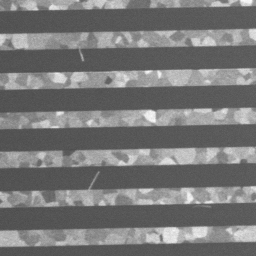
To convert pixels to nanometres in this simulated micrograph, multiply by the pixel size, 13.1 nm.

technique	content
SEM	parallel lines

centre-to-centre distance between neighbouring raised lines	513	nm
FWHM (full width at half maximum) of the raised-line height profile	207	nm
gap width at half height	310	nanometers